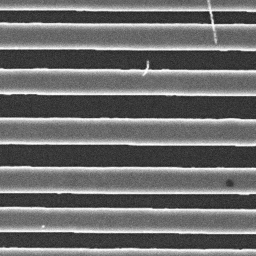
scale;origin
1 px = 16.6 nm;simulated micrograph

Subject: lines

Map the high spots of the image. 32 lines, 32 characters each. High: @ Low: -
@@@@@@@@@@@@@@@@@@@@@@@@@@@@@@@@
--------------------------------
--------------------------------
@@@@@@@@@@@@@@@@@@@@@@@@@@@@@@@@
@@@@@@@@@@@@@@@@@@@@@@@@@@@@@@@@
@@@@@@@@@@@@@@@@@@@@@@@@@@@@@@@@
--------------------------------
--------------------------------
--------------------------------
@@@@@@@@@@@@@@@@@@@@@@@@@@@@@@@@
@@@@@@@@@@@@@@@@@@@@@@@@@@@@@@@@
@@@@@@@@@@@@@@@@@@@@@@@@@@@@@@@@
--------------------------------
--------------------------------
--------------------------------
@@@@@@@@@@@@@@@@@@@@@@@@@@@@@@@@
@@@@@@@@@@@@@@@@@@@@@@@@@@@@@@@@
@@@@@@@@@@@@@@@@@@@@@@@@@@@@@@@@
--------------------------------
--------------------------------
--------------------------------
@@@@@@@@@@@@@@@@@@@@@@@@@@@@@@@@
@@@@@@@@@@@@@@@@@@@@@@@@@@@@@@@@
@@@@@@@@@@@@@@@@@@@@@@@@@@@@@@@@
--------------------------------
--------------------------------
@@@@@@@@@@@@@@@@@@@@@@@@@@@@@@@@
@@@@@@@@@@@@@@@@@@@@@@@@@@@@@@@@
@@@@@@@@@@@@@@@@@@@@@@@@@@@@@@@@
--------------------------------
--------------------------------
@@@@@@@@@@@@@@@@@@@@@@@@@@@@@@@@